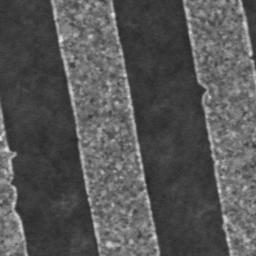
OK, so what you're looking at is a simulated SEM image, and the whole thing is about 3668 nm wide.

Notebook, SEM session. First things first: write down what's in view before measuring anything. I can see one or a few lines or trenches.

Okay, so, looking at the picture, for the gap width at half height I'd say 1030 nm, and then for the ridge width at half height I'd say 810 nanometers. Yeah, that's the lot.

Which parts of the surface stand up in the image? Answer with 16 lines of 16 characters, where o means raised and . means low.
...oooo.....ooo.
....ooo.....ooo.
....ooo.....oooo
....oooo....oooo
....oooo....oooo
....oooo.....ooo
.....ooo.....ooo
.....ooo.....ooo
.....ooo.....ooo
o....oooo....ooo
o....oooo....ooo
o....oooo.....oo
o.....ooo.....oo
o.....ooo.....oo
o.....oooo....oo
oo....oooo....oo